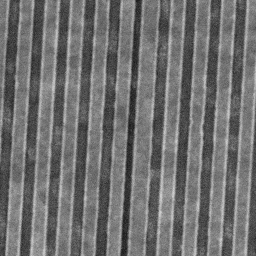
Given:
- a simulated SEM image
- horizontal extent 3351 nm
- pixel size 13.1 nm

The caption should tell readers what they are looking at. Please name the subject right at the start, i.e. parallel lines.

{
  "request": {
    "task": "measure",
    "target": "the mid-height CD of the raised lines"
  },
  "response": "178 nm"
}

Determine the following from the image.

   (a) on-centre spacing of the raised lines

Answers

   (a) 0.33 µm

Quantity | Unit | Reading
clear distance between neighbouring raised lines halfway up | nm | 155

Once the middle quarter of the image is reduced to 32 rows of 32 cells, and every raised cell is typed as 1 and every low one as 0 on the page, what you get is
01110001110000111001111000111000
01110001110000111001111000111000
01110001110000110001111000111000
01110001110001110001111000111000
01110001110001110001111000111000
01110001110001110001110000111000
01110001110001110001110000111000
11100001110001110011110000111000
11100001110001110011110000111000
11110001110001110011110000111000
11100001110001110011110000111000
11100001110001110011110001110000
11100001110001110011110001110000
11100011100001110011110001110000
11100011100001110011110001110000
11100011100001110011110001110000
11100011100001110011110001110000
11100011100001110011110001110000
11100011100001110011110001110001
11100011100001100011110001110001
11100011100011100011110001110001
11100011100011100011110001110001
11100011100011100011100001110001
11100011100011100011100001110001
11000011100011100111100001110001
11000011100011100111100001110001
11100011100011100111100001110001
11100011100011100111100001110001
11000011100011100111100011100001
11000011100011100111100011100001
11000011000011100111100011110001
11000111000011100111100011110001